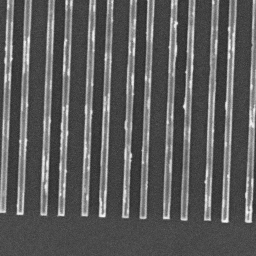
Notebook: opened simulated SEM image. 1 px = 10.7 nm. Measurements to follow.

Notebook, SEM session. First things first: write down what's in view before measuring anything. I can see parallel lines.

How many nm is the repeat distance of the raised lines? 218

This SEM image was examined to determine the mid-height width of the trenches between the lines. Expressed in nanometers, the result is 169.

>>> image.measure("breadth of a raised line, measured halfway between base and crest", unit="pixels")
6.5